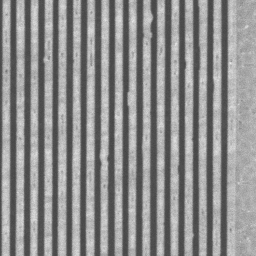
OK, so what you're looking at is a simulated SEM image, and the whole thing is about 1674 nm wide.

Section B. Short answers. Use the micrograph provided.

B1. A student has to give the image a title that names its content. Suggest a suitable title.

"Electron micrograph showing parallel lines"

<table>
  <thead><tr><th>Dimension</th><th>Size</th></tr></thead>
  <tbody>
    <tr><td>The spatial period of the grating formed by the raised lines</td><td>14.1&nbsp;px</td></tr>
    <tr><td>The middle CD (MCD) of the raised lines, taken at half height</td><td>57.2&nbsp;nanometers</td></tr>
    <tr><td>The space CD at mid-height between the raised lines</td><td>31.9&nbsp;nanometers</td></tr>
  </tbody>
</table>